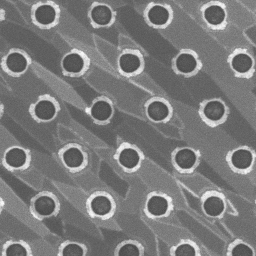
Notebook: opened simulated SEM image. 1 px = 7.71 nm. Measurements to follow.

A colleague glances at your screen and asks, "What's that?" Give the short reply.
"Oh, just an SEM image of a regular array of holes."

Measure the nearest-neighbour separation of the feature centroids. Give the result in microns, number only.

0.424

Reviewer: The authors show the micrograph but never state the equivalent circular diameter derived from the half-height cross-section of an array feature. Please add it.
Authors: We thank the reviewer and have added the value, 166 nm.